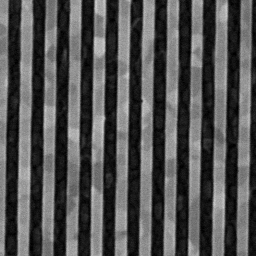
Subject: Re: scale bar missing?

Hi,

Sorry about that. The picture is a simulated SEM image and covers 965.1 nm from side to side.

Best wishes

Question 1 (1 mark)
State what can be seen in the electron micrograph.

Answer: parallel lines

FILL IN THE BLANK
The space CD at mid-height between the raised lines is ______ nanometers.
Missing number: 51.3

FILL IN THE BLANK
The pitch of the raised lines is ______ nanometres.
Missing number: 91.7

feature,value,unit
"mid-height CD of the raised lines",10.8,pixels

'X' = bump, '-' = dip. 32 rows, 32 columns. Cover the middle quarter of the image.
--XX----XX----XX----XX----XX----
--XX----XX----XX----XX----XX----
--XX----XX----XX----XX----XX----
--XX----XX----XX----XX----XX----
-XXX----XX----XX----XX----XX----
-XXX---XXX----XX----XX----XX----
-XXX---XXX----XX----XX----XX----
-XXX----XX----XX----XX----XX----
-XXX----XX----XX----XX----XX----
-XXX----XX---XXX----XX----XX----
-XXX----XX---XXX---XXX----XX----
-XXX---XXX---XXX---XXX----XX----
-XXX---XXX---XXX---XXX----XX----
-XXX---XXX---XXX----XX----XX----
-XXX---XXX---XXX----XX----XX----
-XXX---XXX---XXX----XX----XX----
-XXX---XXX----XX----XX----XX----
-XXX---XXX----XX----XX---XXX----
-XXX---XXX---XXX----XX---XXX----
-XXX---XXX---XXX----XX---XXX----
-XXX---XXX---XXX----XX---XXX----
-XXX---XXX---XXX----XX---XXX----
-XXX---XXX---XXX----XX---XXX----
-XXX---XXX---XXX----XX---XXX----
-XXX---XXX---XXX----XX---XXX---X
-XXX---XXX---XXX---XXX----XX---X
-XXX---XXX---XXX---XXX----XX---X
-XXX---XX----XXX---XXX----XX---X
-XXX---XX----XXX---XXX---XXX---X
-XXX---XX----XXX---XXX---XXX---X
-XXX---XX----XXX---XXX---XXX----
-XXX---XX----XXX---XXX---XXX----